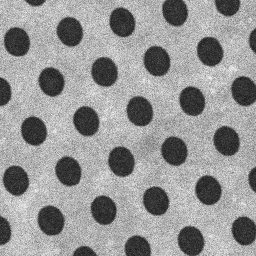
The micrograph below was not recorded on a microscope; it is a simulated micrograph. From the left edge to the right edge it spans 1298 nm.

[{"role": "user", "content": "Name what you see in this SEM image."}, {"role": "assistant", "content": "a regular array of holes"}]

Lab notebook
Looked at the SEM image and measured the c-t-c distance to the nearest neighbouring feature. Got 265 nm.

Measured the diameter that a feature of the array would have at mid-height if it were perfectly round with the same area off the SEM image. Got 0.141 micrometres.